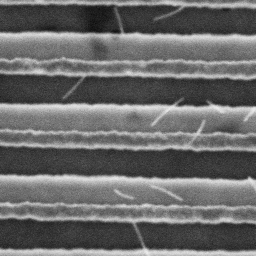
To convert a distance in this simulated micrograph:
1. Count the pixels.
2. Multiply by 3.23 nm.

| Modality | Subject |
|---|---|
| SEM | lines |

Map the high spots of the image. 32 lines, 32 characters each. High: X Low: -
---------------X-----XXXXXXXXXXX
--------------------------------
--------------------------------
--------------------------------
XXXXXXXXXXXXXXXXXXXXXX--XX---X--
XXXXXXXXXXXXXXXXXXXXXXXXXXXXXXXX
XXXXXXXXXXXXXXXXXXXXXXXXXXXXXXXX
XXXXXXXXXXXXXXXXXXXXXXXXXXXXXXXX
XXXXXXXXXXXXXXXXXXXXXXXXXXXXXXXX
----------------------XXXXXXXXXX
--------------------------------
--------------------------------
--------------------------------
XXXXXXXXXXXXXXXXXXXXXXXXXXXXX--X
XXXXXXXXXXXXXXXXXXXXXXXXXXXXXXXX
XXXXXXXXXXXXXXXXXXXXXXXXXXXXXXXX
XXXXXXXXXXXXXXXXXXXXXXXXXXXXXXXX
XXXXXXXXXXXXXXXXXXXXXXXXXXXXXXXX
----------------XX------XXXXXXXX
--------------------------------
--------------------------------
--------------------------------
XXXXXXXXXXXXXXXXXXXXXXXXXXXX---X
XXXXXXXXXXXXXXXXXXXXXXXXXXXXXXXX
XXXXXXXXXXXXXXXXXXXXXXXXXXXXXXXX
XXXXXXXXXXXXXXXXXXXXXXXXXXXXXXXX
XXXXXXXXXXXXXXXXXXXXXXXXXXXXXXXX
---------------XXXXXXXXXXXXXXXXX
--------------------------------
--------------------------------
--------------------------------
XXXXXXXXXXXXXXX-XXXXXXXXX--X---X